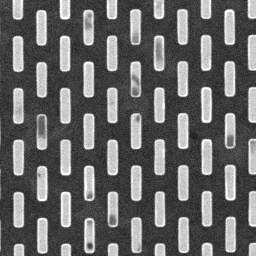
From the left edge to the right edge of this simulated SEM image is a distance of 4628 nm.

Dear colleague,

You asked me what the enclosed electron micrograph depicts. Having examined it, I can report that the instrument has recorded groups of lines, slits or small figures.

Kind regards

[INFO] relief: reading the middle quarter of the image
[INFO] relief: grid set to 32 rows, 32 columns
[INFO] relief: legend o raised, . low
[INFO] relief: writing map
o....oo....oo....oo....oo....oo.
o....oo....oo....oo....oo....oo.
.....oo..........oo..........oo.
.....oo..........oo..........oo.
.....oo..........oo..........oo.
.....oo..........oo..........oo.
o....oo....oo....oo....oo....oo.
o....oo....oo....oo....oo....oo.
o..........oo..........oo.......
o..........oo..........oo.......
o..........oo..........oo.......
o..........oo..........oo.......
o..........oo..........oo.......
o....oo....oo....oo....oo....oo.
o....oo.....o....oo..........oo.
.....oo..........oo..........oo.
.....oo..........oo..........oo.
.....oo..........oo..........oo.
.....oo..........oo..........oo.
o....oo....oo....oo....oo....oo.
o....oo....oo....oo....oo....oo.
o..........oo..........oo.......
o..........oo..........oo.......
o..........oo..........oo.......
o..........oo..........oo.......
o..........oo..........oo....o..
o....oo....oo....oo....oo....oo.
.....oo..........oo..........oo.
.....oo..........oo..........oo.
.....oo..........oo..........oo.
.....oo..........oo..........oo.
.....oo..........oo..........oo.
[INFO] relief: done